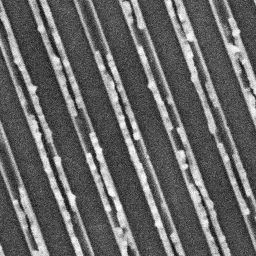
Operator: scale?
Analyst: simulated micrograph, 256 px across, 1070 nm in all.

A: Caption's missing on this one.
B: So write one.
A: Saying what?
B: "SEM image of parallel lines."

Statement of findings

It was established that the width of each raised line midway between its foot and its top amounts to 62.8 nanometers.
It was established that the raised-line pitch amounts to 177 nm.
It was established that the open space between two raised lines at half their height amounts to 113 nanometers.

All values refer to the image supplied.